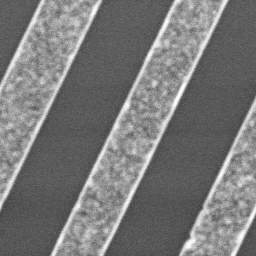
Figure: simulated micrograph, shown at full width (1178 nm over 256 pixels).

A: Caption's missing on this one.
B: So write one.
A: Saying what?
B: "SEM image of one or a few lines or trenches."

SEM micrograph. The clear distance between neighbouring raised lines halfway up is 311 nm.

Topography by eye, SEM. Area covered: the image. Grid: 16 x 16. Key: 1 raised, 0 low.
0011100000011100
0011110000111000
0111100000111000
0111100001110000
1111000001110000
1111000011100000
1110000011100000
1110000111100001
1100000111000001
1100001111000011
1000001110000001
1000011110000111
0000011100000111
0000111100001111
0000111000001110
0000110000001110